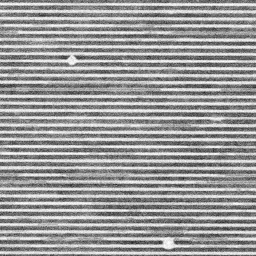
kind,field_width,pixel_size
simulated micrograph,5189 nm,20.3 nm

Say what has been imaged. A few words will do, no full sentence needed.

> parallel lines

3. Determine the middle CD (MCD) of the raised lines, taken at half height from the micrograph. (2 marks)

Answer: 0.0355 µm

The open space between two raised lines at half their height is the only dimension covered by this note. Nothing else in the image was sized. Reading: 106 nm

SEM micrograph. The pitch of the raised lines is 144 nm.